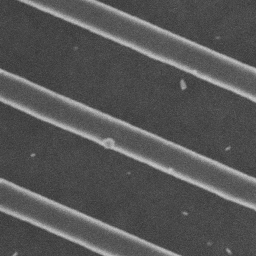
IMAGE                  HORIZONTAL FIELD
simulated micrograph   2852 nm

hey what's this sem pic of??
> lines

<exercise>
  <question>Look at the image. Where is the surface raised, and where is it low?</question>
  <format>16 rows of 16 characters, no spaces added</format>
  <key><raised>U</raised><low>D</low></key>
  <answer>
DDUUUUUDDDDDDDDD
DDDDDUUUUDDDDDDD
DDDDDDDUUUUUDDDD
DDDDDDDDDUUUUUDD
DDDDDDDDDDDDUUUU
UUUDDDDDDDDDDDUU
UUUUUDDDDDDDDDDD
DDDUUUUDDDDDDDDD
DDDDDUUUUUDDDDDD
DDDDDDDUUUUUDDDD
DDDDDDDDDDUUUUDD
UDDDDDDDDDDDUUUU
UUUDDDDDDDDDDDUU
DUUUUDDDDDDDDDDD
DDDUUUUUDDDDDDDD
DDDDDUUUUUDDDDDD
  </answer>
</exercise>